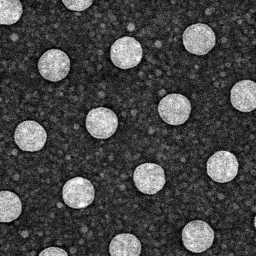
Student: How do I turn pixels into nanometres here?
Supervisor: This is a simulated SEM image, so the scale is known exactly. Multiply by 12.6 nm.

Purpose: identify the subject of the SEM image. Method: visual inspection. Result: a regular array of raised bodies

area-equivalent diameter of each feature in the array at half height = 393 nanometers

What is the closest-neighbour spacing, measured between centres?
919 nm